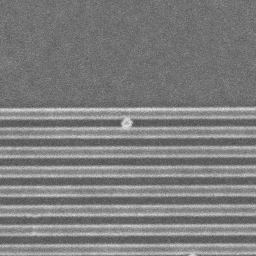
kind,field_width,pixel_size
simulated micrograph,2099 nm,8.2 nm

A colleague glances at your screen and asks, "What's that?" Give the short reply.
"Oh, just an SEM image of parallel lines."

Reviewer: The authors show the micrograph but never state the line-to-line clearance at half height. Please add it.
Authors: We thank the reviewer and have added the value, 10.1 pixels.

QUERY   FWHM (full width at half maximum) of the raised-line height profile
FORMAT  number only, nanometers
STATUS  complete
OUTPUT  74.8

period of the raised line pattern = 19.4 pixels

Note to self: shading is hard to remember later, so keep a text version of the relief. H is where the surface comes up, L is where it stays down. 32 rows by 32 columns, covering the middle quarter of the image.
LLLLLLLLLLLLLLLLLLLLLLLLLLLLLLLL
LLLLLLLLLLLLLLLLLLLLLLLLLLLLLLLL
LLLLLLLLLLLLLLLLLLLLLLLLLLLLLLLL
LLLLLLLLLLLLLLLLLLLLLLLLLLLLLLLL
LLLLLLLLLLLLLLLLLLLLLLLLLLLLLLLL
LLLLLLLLLLLLLLLLLLLLLLLLLLLLLLLL
LLLLLLLLLLLLLLLLLLLLLLLLLLLLLLLL
LLLLLLLLLLLLLLLLLLLLLLLLLLLLLLLL
LLLLLLLLLLLLLLLLLLLLLLLLLLLLLLLL
LLLLLLLLLLLLLLLLLLLLLLLLLLLLLLLL
LLLLLLLLLLLLLLLLLLLLLLLLLLLLLLLL
HHHHHHHHHHHHHHHHHHHHHHHHHHHHHHHH
HHHHHHHHHHHHHHHHHHHHHHHHHHHHHHHH
LLLLLLLLLLLLLLLHHLLLLLLLLLLLLLLL
LLLLLLLLLLLLLLLHHLLLLLLLLLLLLLLL
LLLLLLLLLLLLLLLHHLLLLLLLLLLLLLLL
HHHHHHHHHHHHHHHHHHHHHHHHHHHHHHHH
HHHHHHHHHHHHHHHHHHHHHHHHHHHHHHHH
LLLLLLLLLLLLLLLLLLLLLLLLLLLLLLLL
LLLLLLLLLLLLLLLLLLLLLLLLLLLLLLLL
LLLLLLLLLLLLLLLLLLLLLLLLLLLLLLLL
HHHHHHHHHHHHHHHHHHHHHHHHHHHHHHHH
HHHHHHHHHHHHHHHHHHHHHHHHHHHHHHHH
LLLLLLLLLLLLLLLLLLLLLLLLLLLLLLLL
LLLLLLLLLLLLLLLLLLLLLLLLLLLLLLLL
LLLLLLLLLLLLLLLLLLLLLLLLLLLLLLLL
HHHHHHHHHHHHHHHHHHHHHHHHHHHHHHHH
HHHHHHHHHHHHHHHHHHHHHHHHHHHHHHHH
LLLLLLLLLLLLLLLLLLLLLLLLLLLLLLLL
LLLLLLLLLLLLLLLLLLLLLLLLLLLLLLLL
LLLLLLLLLLLLLLLLLLLLLLLLLLLLLLLL
HHHHHHHHHHHHHHHHHHHHHHHHHHHHHHHH